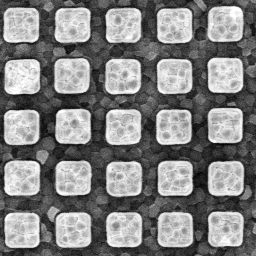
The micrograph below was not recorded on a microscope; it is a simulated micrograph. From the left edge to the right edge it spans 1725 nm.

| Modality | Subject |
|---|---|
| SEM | a regular array of raised bodies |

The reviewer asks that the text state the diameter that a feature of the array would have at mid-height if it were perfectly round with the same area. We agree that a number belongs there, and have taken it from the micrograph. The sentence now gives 246 nm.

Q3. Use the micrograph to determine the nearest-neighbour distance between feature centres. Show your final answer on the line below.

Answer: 340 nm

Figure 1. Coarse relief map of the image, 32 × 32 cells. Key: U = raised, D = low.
DDDDDDDDDDDDDDDDDDDDDDDDDDDDDDDD
DUUUUDDUUUUDDDUUUDDDUUUUDDUUUUDD
DUUUUDDUUUUDDUUUUDDDUUUUDDUUUUDD
DUUUUDDUUUUDDUUUUDDDUUUUDDUUUUDD
DUUUUDDUUUUDDUUUUDDDUUUUDDUUUUDD
DDDDDDDDDDDDDDDDDDDDDDDDDDDDDDDD
DDDDDDDDDDDDDDDDDDDDDDDDDDDDDDDD
DDDDDDDUUUUDDDDDDDDDDDDDDDDUUUDD
DUUUUDDUUUUDDUUUUDDDUUUUDDUUUUDD
DUUUUDDUUUUDDUUUUDDDUUUUDDUUUUDD
DUUUDDDUUUUDDUUUUDDDUUUUDDUUUUDD
DUUDDDDDUDDDDDUUUDDDUUUDDDDDDDDD
DDDDDDDDDDDDDDDDDDDDDDDDDDDDDDDD
DDDDDDDDDDDDDDDDDDDDDDDDDDDDDDDD
DUUUUDDUUUUDDUUUUDDDUUUUDDUUUUDD
DUUUUDDUUUUDDUUUUDDDUUUUDDUUUUDD
DUUUUDDUUUUDDUUUUDDDUUUUDDUUUUDD
DUUUUDDUUUUDDUUUUDDDUUUUDDUUUUDD
DDDDDDDDDDDDDDDDDDDDDDDDDDDDDDDD
DDDDDUDDDDDDDDDDDDDDDDDDDDDDDDDD
DUUUUDDUUUUDDDUUUDDDUUUUDDDUUUDD
DUUUUDDUUUUDDUUUUUDDUUUUDDUUUUDD
DUUUUDDUUUUDDUUUUUDDUUUUDDUUUUDD
DUUUUDDUUUUDDUUUUUDDUUUUDDUUUUDD
DDDDDDDDDDDDDDDDDDDDDDDDDDDDDDDD
DDDDDDDDDDDDDDDDDDDDDDDDDDDDDDDD
DDDDDDDDDDDDDDDDDDDDDDDDDDDDDDDD
DUUUUDDUUUUDDUUUUUDDUUUUDDUUUUDD
DUUUUDDUUUUDDUUUUUDDUUUUDDUUUUDD
DUUUUDDUUUUDDUUUUUDDUUUUDDUUUUDD
DUUUUDDUUUUDDDUUUDDDUUUUDDUUUUDD
DDDDDDDDDDDDDDDDDDDDDDDDDDDDDDDD